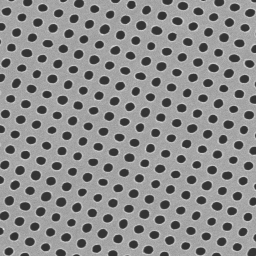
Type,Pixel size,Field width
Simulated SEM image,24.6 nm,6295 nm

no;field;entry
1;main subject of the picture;a regular array of holes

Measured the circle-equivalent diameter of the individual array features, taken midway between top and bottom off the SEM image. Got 224 nm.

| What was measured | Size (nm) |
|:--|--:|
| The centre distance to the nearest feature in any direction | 392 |